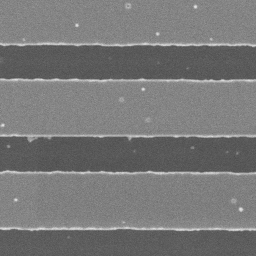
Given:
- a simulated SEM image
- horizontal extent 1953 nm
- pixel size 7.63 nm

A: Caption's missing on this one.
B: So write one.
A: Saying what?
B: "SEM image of lines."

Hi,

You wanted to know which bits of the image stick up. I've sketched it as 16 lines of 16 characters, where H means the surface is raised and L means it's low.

HHHHHHHHHHHHHHHH
HHHHHHHHHHHHHHHH
HHHHHHHHHHHHHHHH
LLLLLLLLLLLLLLLL
LLLLLLLLLLLLLLLL
HHHHHHHHHHHHHHHH
HHHHHHHHHHHHHHHH
HHHHHHHHHHHHHHHH
LHLLLHHLHHHHHHHH
LLLLLLLLLLLLLLLL
LLLLLLLLLLLLLLLL
HHHHHHHHHHHHHHHH
HHHHHHHHHHHHHHHH
HHHHHHHHHHHHHHHH
LLLLLLLLLLLLLLLL
LLLLLLLLLLLLLLLL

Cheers